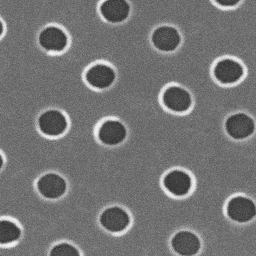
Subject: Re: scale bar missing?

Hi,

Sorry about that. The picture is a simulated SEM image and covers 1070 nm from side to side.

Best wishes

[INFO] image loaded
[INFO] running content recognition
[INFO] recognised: a regular array of holes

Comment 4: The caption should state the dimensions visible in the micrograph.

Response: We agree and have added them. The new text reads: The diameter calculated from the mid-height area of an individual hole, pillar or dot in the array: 112 nm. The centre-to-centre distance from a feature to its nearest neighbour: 253 nm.